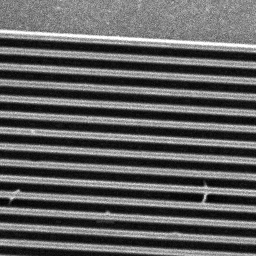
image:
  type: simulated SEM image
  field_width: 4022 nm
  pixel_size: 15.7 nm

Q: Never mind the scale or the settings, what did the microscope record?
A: parallel lines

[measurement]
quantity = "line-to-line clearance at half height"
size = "139 nm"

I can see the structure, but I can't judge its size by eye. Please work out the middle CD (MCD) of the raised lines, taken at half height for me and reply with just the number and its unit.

108 nanometres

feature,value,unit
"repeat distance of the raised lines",16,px